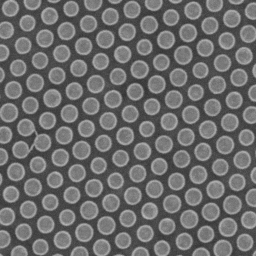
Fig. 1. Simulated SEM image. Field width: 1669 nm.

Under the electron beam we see a regular array of raised bodies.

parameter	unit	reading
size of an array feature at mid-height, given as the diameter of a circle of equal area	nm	105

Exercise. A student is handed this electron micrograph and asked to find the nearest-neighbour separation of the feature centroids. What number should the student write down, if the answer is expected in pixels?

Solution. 22.6